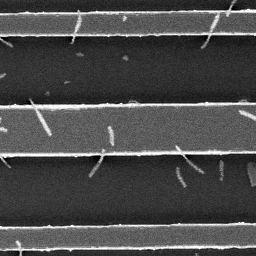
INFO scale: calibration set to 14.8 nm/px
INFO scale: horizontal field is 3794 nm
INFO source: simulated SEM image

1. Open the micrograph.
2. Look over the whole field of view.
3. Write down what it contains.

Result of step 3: lines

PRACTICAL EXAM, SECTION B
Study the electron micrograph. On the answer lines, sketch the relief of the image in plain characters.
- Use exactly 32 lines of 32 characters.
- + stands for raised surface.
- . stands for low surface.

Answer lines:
................................
......................++++++++++
++++++++++++++++++++++++++++++++
++++++++++++++++++++++++++++++++
+........+......................
................................
................................
................................
................................
................................
................................
................................
................................
++++++++++++++++++++++++++++++++
++++++++++++++++++++++++++++++++
++++++++++++++++++++++++++++++++
++++++++++++++++++++++++++++++++
++++++++++++++++++++++++++++++++
++++++++++++++++++++++++++++++++
+...........+...................
................................
................................
................................
................................
................................
................................
................................
................................
++++++++++++++++++++++++++++++++
++++++++++++++++++++++++++++++++
++++++++++++++++++++++++++++++++
................................